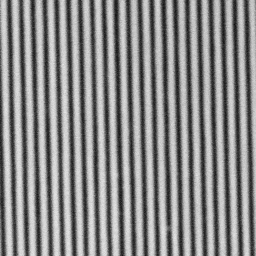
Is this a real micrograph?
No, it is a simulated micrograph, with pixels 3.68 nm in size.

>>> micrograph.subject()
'parallel lines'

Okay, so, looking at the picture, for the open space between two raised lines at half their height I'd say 17.9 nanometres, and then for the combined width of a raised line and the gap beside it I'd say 0.0436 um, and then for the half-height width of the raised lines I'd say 24.8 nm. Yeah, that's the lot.